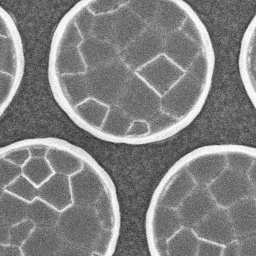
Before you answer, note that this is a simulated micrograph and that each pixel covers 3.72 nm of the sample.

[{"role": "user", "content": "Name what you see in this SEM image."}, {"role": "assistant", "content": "raised bodies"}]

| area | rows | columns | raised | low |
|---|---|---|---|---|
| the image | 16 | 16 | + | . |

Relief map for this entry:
.....+++++++....
+...++++++++....
+...+++++++++..+
+..++++++++++..+
+..++++++++++..+
+..++++++++++..+
....+++++++++...
.....+++++++....
......++++......
+++++.......++++
++++++.....+++++
+++++++...++++++
+++++++...++++++
+++++++..+++++++
+++++++..+++++++
+++++++...++++++